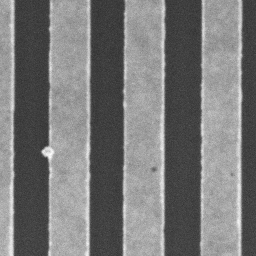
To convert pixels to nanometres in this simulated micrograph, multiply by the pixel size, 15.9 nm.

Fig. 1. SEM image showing lines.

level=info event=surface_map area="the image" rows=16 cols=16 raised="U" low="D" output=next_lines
UDDUUUDDUUDDDUUD
UDDUUUDDUUDDDUUD
UDDUUUDDUUDDDUUD
UDDUUUDDUUDDDUUD
UDDUUUDDUUDDDUUD
UDDUUUDDUUDDDUUD
UDDUUUDDUUDDDUUD
UDDUUUDDUUDDDUUD
UDDUUUDDUUDDDUUD
UDDUUUDDUUDDDUUD
UDDUUUDDUUDDDUUD
UDDUUUDDUUDDDUUD
UDDUUUDDUUDDDUUD
UDDUUUDDUUDDDUUD
UDDUUUDDUUDDDUUD
UDDUUUDDUUDDDUUD